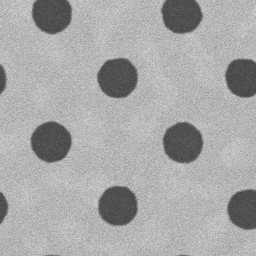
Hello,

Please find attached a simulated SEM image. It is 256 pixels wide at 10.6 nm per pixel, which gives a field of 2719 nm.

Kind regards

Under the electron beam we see holes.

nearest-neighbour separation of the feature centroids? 969 nm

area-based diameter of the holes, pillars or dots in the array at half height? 427 nanometers